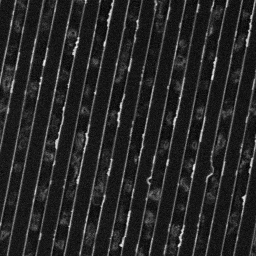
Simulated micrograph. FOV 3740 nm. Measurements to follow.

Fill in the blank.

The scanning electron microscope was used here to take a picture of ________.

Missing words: parallel lines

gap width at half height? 181 nm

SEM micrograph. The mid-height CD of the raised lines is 15.3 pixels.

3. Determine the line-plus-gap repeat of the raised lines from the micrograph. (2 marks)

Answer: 406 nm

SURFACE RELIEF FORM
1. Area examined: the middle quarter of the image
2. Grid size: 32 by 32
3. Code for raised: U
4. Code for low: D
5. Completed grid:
DDUUUUDDDUUUUDDDUUUUDDDDUUUDDDDU
DDUUUUDDDUUUUDDDUUUUDDDUUUUDDDUU
DDUUUUDDDUUUUDDDUUUUDDDUUUUDDDUU
DUUUUUDDDUUUUDDDUUUDDDDUUUUDDDUU
DUUUUDDDUUUUDDDDUUUDDDDUUUUDDDUU
DUUUUDDDUUUUDDDUUUUDDDUUUUDDDDUU
DUUUUDDDUUUUDDDUUUUDDDUUUUDDDUUU
DUUUUDDDUUUUDDDUUUUDDDUUUUDDDUUU
UUUUUDDDUUUUDDDUUUDDDDUUUUDDDUUU
UUUUDDDUUUUDDDUUUUDDDDUUUUDDDUUU
UUUUDDDUUUUDDDUUUUDDDUUUUDDDDUUU
UUUUDDDUUUUDDDUUUUDDDUUUUDDDUUUU
UUUUDDDUUUUDDUUUUUDDDUUUUDDDUUUU
UUUDDDDUUUUDDUUUUDDDDUUUUDDDUUUU
UUUDDDUUUUDDDUUUUDDDDUUUUDDUUUUU
UUUDDDUUUUDDDUUUUDDDUUUUDDDUUUUU
UUUDDDUUUUDDDUUUUDDDUUUUDDDUUUUD
UUUDDDUUUUDDDUUUUDDDUUUUDDDUUUUD
UUUDDDUUUUDDDUUUUDDDUUUUDDDUUUUD
UUDDDUUUUDDDDUUUUDDDUUUUDDDUUUUD
UUDDDUUUUDDDDUUUDDDUUUUDDDUUUUUD
UUDDDUUUUDDDUUUUDDDUUUUDDDUUUUDD
UUDDDUUUUDDDUUUUDDDUUUUDDDUUUUDD
UDDDDUUUUDDDUUUUDDDUUUUDDDUUUUDD
UDDDUUUUUDDDUUUUDDDUUUDDDDUUUUDD
UDDDUUUUDDDDUUUDDDUUUUDDDDUUUDDD
UDDDUUUUDDDUUUUDDDUUUUDDDUUUUDDD
UDDDUUUUDDDUUUUDDDUUUUDDDUUUUDDD
DDDUUUUUDDDUUUUDDDUUUUDDDUUUUDDD
DDDUUUUUDDDUUUUDDDUUUDDDDUUUUDDD
DDDUUUUDDDDUUUDDDUUUUDDDDUUUUDDD
DDDUUUUDDDUUUUDDDUUUUDDDUUUUDDDU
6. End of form